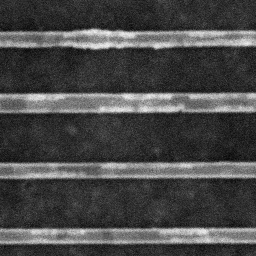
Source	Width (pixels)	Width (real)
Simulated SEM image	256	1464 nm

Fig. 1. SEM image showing one or a few lines or trenches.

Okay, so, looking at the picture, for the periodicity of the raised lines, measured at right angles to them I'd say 65.6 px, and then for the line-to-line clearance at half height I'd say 295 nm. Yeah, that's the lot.